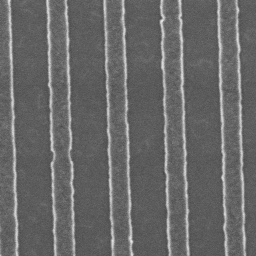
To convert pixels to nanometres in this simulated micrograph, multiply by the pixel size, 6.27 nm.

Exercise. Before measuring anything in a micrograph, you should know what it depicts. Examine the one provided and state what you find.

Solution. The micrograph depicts parallel lines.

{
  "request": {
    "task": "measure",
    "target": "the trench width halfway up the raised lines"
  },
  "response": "235 nm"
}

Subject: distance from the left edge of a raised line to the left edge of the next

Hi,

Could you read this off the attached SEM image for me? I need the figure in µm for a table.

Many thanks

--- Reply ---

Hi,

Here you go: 0.356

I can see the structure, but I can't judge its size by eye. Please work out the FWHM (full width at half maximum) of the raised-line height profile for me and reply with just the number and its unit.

124 nm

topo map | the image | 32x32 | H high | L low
HLLLLLHHLLLLLHHLLLLLHHLLLLLHHHLL
HLLLLLHHLLLLLHHLLLLLHHHLLLLHHHLL
HLLLLLHHLLLLLHHLLLLLHHHLLLLHHHLL
HLLLLLHHHLLLLHHHLLLLHHHLLLLHHHLL
HLLLLLHHHLLLLHHLLLLLHHHLLLLHHHLL
HLLLLLHHHLLLLHHHLLLLHHHLLLLHHHLL
HLLLLLHHHLLLLHHHLLLLHHHLLLLHHHLL
HLLLLLHHHLLLLHHHLLLLHHHLLLLHHHLL
HHLLLLHHHLLLLHHHLLLLHHHLLLLLHHLL
HHLLLLHHHLLLLHHHLLLLHHHLLLLHHHLL
HHLLLLHHHLLLLHHHLLLLLHHLLLLHHHLL
HLLLLLHHHLLLLHHHLLLLLHHLLLLLHHLL
HHLLLLHHHLLLLHHHLLLLLHHLLLLLHHLL
HHLLLLHHHLLLLHHHLLLLLHHLLLLLHHLL
HHLLLLHHHLLLLHHHLLLLLHHLLLLLHHLL
HHLLLLHHHLLLLHHHLLLLLHHLLLLLHHLL
HHLLLLHHHLLLLHHHLLLLLHHLLLLLHHLL
HHLLLLHHHLLLLLHHLLLLLHHLLLLLHHLL
HHLLLLHHHLLLLLHHLLLLLHHLLLLLHHLL
HHLLLLLHHLLLLLHHLLLLLHHLLLLLHHLL
HHLLLLHHHLLLLLHHLLLLLHHLLLLLHHLL
HHLLLLLHHLLLLLHHLLLLLHHLLLLLHHLL
HHLLLLLHHLLLLLHHLLLLLHHLLLLLHHLL
HHLLLLLHHLLLLLHHLLLLLHHLLLLLHHLL
HHLLLLLHHLLLLLHHLLLLLHHLLLLLHHLL
HHLLLLLHHLLLLLHHLLLLLHHLLLLLHHLL
HHLLLLLHHLLLLLHHLLLLLHHLLLLLHHLL
HHLLLLLHHLLLLLHHLLLLLHHLLLLLHHLL
HHLLLLLHHLLLLLHHLLLLLHHLLLLLHHLL
HHLLLLLHHLLLLLHHLLLLLHHHLLLLHHHL
HHLLLLLHHLLLLLHHLLLLLHHLLLLLHHHL
HHLLLLLHHLLLLLHHLLLLLHHHLLLLHHHL